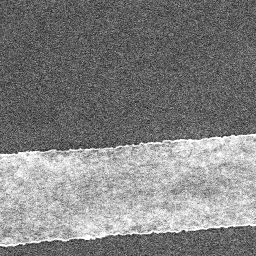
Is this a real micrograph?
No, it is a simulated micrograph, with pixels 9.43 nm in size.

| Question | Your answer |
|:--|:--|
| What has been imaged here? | one or a few lines or trenches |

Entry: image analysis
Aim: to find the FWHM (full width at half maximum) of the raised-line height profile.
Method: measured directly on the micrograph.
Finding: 87.9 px